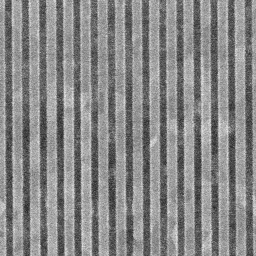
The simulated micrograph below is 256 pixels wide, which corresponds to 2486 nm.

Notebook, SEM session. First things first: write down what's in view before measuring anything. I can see parallel lines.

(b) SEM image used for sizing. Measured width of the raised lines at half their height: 0.0874 micrometres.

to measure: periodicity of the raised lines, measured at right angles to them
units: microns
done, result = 0.166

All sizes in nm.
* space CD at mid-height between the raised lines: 82.5